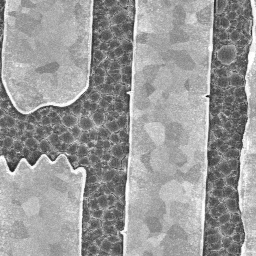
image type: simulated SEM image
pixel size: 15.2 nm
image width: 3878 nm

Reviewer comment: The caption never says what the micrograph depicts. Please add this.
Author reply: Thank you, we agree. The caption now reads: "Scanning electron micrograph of one or a few lines or trenches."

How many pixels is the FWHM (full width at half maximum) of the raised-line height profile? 77.1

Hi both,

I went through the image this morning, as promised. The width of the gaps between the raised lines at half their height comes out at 645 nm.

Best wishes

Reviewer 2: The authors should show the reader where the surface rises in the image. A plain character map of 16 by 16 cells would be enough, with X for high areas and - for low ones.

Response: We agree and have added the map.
XXXXXX---XXXX---
XXXXXX--XXXXX---
XXXXXX--XXXXX---
XXXXXX--XXXXX---
XXXXXX--XXXXX--X
XXXXX---XXXXX--X
-XXX----XXXXX---
--------XXXXX--X
--------XXXXX--X
--------XXXXX--X
XXXXX---XXXXX--X
XXXXX---XXXXX--X
XXXXX---XXXXX--X
XXXXX---XXXXX--X
XXXXX---XXXXX--X
XXXXX---XXXXX--X